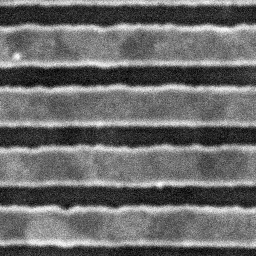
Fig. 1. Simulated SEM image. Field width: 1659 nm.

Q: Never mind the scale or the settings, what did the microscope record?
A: lines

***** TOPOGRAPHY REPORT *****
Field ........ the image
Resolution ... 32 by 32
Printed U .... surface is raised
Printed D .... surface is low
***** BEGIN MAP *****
UUDDDUUUUDUUUUUUUUUUDUUUUDDUUUUD
DDDDDDDDDDDDDDDDDDDDDDDDDDDDDDDD
DDDDDDDDDDDDDDDDDDDDDDDDDDDDDDDD
UUUUUUUUUUUUUUUUUUUUUUUUUUUUDUUU
UUUUUUUUUUUUUUUUUUUUUUUUUUUUUUUU
UUUUUUUUUUUUUUUUUUUUUUUUUUUUUUUU
UUUUUUUUUUUUUUUUUUUUUUUUUUUUUUUU
UUUUUUUUUUUUUUUUUUUUUUUUUUUUUUUU
DDDDDDDDDDDDDDDDDDDDDDDDDDDDDDDD
DDDDDDDDDDDDDDDDDDDDDDDDDDDDDDDD
DDDDDDDDDDDDDDDDDDDDDDDDDDDDDDDD
UUUUUUUUUUUUUUUUUUUUUUUUUUUUUUUU
UUUUUUUUUUUUUUUUUUUUUUUUUUUUUUUU
UUUUUUUUUUUUUUUUUUUUUUUUUUUUUUUU
UUUUUUUUUUUUUUUUUUUUUUUUUUUUUUUU
UUUUUUUUUUUUUUUUUUUUUUUUUUUUUUUU
DDDDDDDDDDDDDDDDDDDDDDDDDDDDDDDD
DDDDDDDDDDDDDDDDDDDDDDDDDDDDDDDD
DDDDDUUUUUUUUUDUDDUUUUUUUUUUUUUU
UUUUUUUUUUUUUUUUUUUUUUUUUUUUUUUU
UUUUUUUUUUUUUUUUUUUUUUUUUUUUUUUU
UUUUUUUUUUUUUUUUUUUUUUUUUUUUUUUU
UUUUUUUUUUUUUUUUUUUUUUUUUUUUUUUU
DDDDDDDDDDDDDDDDDDDDDDDDDDDDDDDD
DDDDDDDDDDDDDDDDDDDDDDDDDDDDDDDD
DDDDDDDDDDDDDDDDDDDDDDDDDDDDDDDD
UUUUUUUUUUUUUUUUUUUUUUUUUUUUUUUU
UUUUUUUUUUUUUUUUUUUUUUUUUUUUUUUU
UUUUUUUUUUUUUUUUUUUUUUUUUUUUUUUU
UUUUUUUUUUUUUUUUUUUUUUUUUUUUUUUU
UDDDUUDUUUUUUUUUUUUUUUUUUUUUUUUU
DDDDDDDDDDDDDDDDDDDDDDDDDDDDDDDD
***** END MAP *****